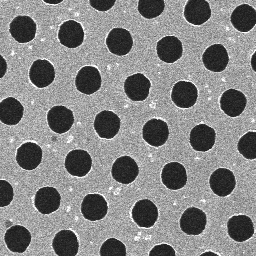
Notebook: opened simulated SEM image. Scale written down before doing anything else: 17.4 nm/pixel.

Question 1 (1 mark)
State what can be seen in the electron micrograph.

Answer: a regular array of holes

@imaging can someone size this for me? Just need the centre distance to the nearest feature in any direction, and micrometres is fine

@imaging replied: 0.822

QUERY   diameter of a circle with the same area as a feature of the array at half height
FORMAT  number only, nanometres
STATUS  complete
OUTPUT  466